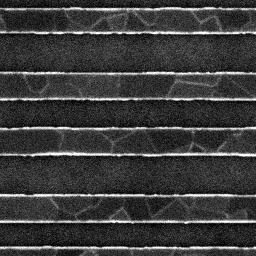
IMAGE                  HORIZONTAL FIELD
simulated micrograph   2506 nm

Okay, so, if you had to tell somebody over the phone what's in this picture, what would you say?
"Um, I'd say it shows lines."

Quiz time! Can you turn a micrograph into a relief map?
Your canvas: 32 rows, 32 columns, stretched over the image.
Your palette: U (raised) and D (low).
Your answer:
DDDDDDDDDDDDDDDDDDDDDDDDDDDDDDDD
UUUUUUUUUUUUUUUUUUUUUUUUUUUUUUUU
UUUUUUUUUUUUUUUUUUUUUUUUUUUUUUUU
UUUUUUUUUUUUUUUUUUUUUUUUUUUUUUUU
DDDDDDDDDDDDDDDDDDDDDDDDDDDDDDDD
DDDDDDDDDDDDDDDDDDDDDDDDDDDDDDDD
DDDDDDDDDDDDDDDDDDDDDDDDDDDDDDDD
DDDDDDDDDDDDDDDDDDDDDDDDDDDDDDDD
DDDDDDDDDDDDDDDDDDDDDDDDDDDDDDDD
UUUUUUUUUUUUUUUUUUUUUUUUUUUUUUUU
UUUUUUUUUUUUUUUUUUUUUUUUUUUUUUUU
UUUUUUUUUUUUUUUUUUUUUUUUUUUUUUUU
DDDDDDDDDDDDDDDDDDDDDDDDDDDDDDDD
DDDDDDDDDDDDDDDDDDDDDDDDDDDDDDDD
DDDDDDDDDDDDDDDDDDDDDDDDDDDDDDDD
DDDDDDDDDDDDDDDDDDDDDDDDDDDDDDDD
UUUUUUUUUUUUUUUUUUUUUUUUUUUUUUUU
UUUUUUUUUUUUUUUUUUUUUUUUUUUUUUUU
UUUUUUUUUUUUUUUUUUUUUUUUUUUUUUUU
DDDDDDDDDDDDDDDDDDDDDDDDDDDDDDDD
DDDDDDDDDDDDDDDDDDDDDDDDDDDDDDDD
DDDDDDDDDDDDDDDDDDDDDDDDDDDDDDDD
DDDDDDDDDDDDDDDDDDDDDDDDDDDDDDDD
DDDDDDDDDDDDDDDDDDDDDDDDDDDDDDDD
UUUUUUUUUUUUUUUUUUUUUUUUUUUUUUUU
UUUUUUUUUUUUUUUUUUUUUUUUUUUUUUUU
UUUUUUUUUUUUUUUUUUUUUUUUUUUUUUUU
UUUUUUUUUUUUUUUUUUUUUUUUUUUUUUUU
DDDDDDDDDDDDDDDDDDDDDDDDDDDDDDDD
DDDDDDDDDDDDDDDDDDDDDDDDDDDDDDDD
DDDDDDDDDDDDDDDDDDDDDDDDDDDDDDDD
UUUUUUUUUUUUUUUUUUUUUUUUUUUUUUUU